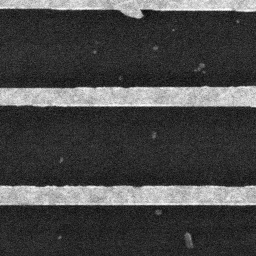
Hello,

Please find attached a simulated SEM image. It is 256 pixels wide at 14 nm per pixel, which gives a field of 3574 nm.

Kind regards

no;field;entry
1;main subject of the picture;lines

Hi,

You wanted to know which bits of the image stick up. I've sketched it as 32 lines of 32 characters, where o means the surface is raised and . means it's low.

oooooooooooooooooooooooooooooooo
...............ooo..............
................................
................................
................................
................................
................................
................................
................................
................................
................................
oooooooooooooooooooooooooooooooo
oooooooooooooooooooooooooooooooo
................................
................................
................................
................................
................................
................................
................................
................................
................................
................................
oooooooooooooooooooooooooooooooo
oooooooooooooooooooooooooooooooo
ooooooooooooooooo.o..oooo.....oo
................................
................................
................................
................................
................................
................................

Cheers